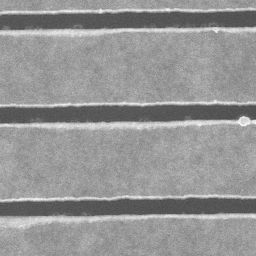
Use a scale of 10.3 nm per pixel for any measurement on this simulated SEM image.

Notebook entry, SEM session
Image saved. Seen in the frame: lines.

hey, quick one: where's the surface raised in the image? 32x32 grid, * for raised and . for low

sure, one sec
********************************
***************.................
................................
.....................*..********
********************************
********************************
********************************
********************************
********************************
********************************
********************************
********************************
********************************
................................
................................
********************************
********************************
********************************
********************************
********************************
********************************
********************************
********************************
********************************
********************************
................................
................................
********************************
********************************
********************************
********************************
********************************